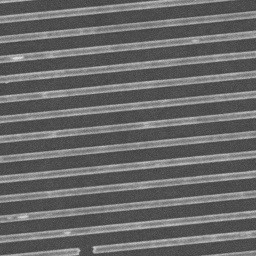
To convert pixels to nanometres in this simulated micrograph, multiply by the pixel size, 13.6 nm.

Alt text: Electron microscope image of parallel lines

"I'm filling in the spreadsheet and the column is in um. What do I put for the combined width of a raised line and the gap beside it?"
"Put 0.27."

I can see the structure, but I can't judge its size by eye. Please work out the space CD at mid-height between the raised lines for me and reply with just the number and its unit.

0.183 microns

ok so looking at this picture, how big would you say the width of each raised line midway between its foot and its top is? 91.3 nm